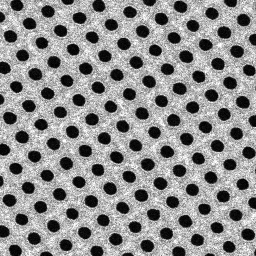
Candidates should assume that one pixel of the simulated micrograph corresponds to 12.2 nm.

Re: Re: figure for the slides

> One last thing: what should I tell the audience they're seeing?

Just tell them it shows a regular array of holes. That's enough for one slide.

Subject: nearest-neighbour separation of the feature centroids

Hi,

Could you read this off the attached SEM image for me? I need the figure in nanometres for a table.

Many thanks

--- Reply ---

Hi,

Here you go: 274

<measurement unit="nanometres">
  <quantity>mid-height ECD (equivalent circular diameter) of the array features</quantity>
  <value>158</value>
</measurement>